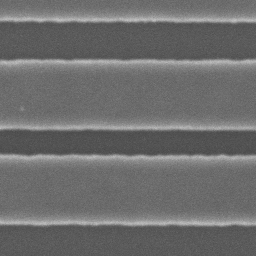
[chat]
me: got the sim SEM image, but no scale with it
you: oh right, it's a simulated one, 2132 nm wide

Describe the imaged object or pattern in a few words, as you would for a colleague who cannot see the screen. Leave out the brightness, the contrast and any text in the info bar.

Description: lines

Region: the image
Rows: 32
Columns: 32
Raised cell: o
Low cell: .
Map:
oooooooooooooooooooooooooooooooo
oooooooooooooooooooooooooooooooo
oooooooooooooooooooooooooooooooo
................................
................................
................................
................................
................................
oooooooooooooooooooooooooooooooo
oooooooooooooooooooooooooooooooo
oooooooooooooooooooooooooooooooo
oooooooooooooooooooooooooooooooo
oooooooooooooooooooooooooooooooo
oooooooooooooooooooooooooooooooo
oooooooooooooooooooooooooooooooo
oooooooooooooooooooooooooooooooo
................................
................................
................................
oooooooooooooooo.o.ooooooooooooo
oooooooooooooooooooooooooooooooo
oooooooooooooooooooooooooooooooo
oooooooooooooooooooooooooooooooo
oooooooooooooooooooooooooooooooo
oooooooooooooooooooooooooooooooo
oooooooooooooooooooooooooooooooo
oooooooooooooooooooooooooooooooo
oooooooooooooooooooooooooooooooo
................................
................................
................................
................................